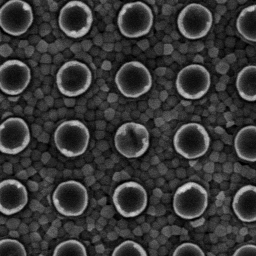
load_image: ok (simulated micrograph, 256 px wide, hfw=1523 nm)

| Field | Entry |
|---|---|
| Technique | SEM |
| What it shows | a regular array of raised bodies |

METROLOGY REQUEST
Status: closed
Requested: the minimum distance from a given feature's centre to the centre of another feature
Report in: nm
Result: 354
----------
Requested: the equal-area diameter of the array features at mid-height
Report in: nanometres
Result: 202